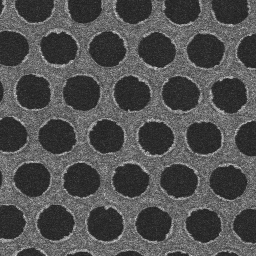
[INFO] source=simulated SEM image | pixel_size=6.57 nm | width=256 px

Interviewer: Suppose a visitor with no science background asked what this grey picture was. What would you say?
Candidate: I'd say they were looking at a regular array of holes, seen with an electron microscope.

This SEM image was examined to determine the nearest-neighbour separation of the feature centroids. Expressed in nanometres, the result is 321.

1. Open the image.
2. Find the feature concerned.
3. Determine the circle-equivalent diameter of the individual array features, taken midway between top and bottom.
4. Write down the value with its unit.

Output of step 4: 232 nm